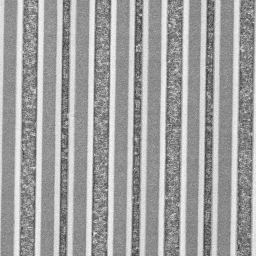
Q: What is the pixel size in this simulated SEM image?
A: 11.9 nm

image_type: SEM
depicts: parallel lines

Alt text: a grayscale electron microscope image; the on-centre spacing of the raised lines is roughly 420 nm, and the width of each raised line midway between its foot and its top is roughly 227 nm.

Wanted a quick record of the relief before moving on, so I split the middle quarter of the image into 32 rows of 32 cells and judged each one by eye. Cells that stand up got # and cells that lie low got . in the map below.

..#####.....#####...#####.....##
..#####.....#####...#####.....##
..#####.....#####...#####.....##
..#####.....#####...#####.....##
..#####.....#####...#####.....##
..#####.....#####...#####.....##
..#####.....#####...#####.....##
..#####.....#####...#####.....##
..#####.....#####...#####.....##
..#####.....#####...#####.....##
..#####.....#####...#####.....##
..#####.....#####...#####.....##
..#####.....#####...#####.....##
..#####.....#####...#####.....##
..#####.....#####...#####.....##
..#####.....#####...#####.....##
..#####.....#####...#####.....##
..#####.....#####...#####.....##
..#####.....#####...#####.....##
..#####.....#####...#####.....##
..#####.....#####...#####.....##
..####......#####...#####.....##
..####......#####...#####.....##
..####......####....#####.....##
..####......####....#####.....##
..####......####....#####.....##
..####......####....#####.....##
..####......####....#####.....##
..####......####....#####.....##
..####......####....#####.....##
..####......####....#####.....##
..####......####....####......##